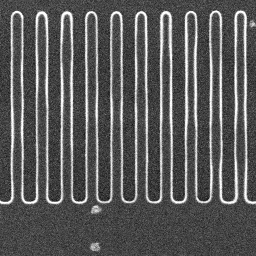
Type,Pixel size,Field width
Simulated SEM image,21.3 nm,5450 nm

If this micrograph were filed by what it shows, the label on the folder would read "groups of lines, slits or small figures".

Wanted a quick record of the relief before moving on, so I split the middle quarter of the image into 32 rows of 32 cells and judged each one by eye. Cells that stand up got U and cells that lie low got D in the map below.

UUDDDDUUDDDDUUDDDDUUUDDDUUUDDDDU
UUDDDDUUDDDDUUDDDDUUUDDDUUUDDDDU
UUDDDDUUDDDDUUDDDDUUUDDDUUUDDDDU
UUDDDDUUDDDDUUDDDDUUUDDDUUUDDDDU
UUDDDDUUDDDDUUDDDDUUUDDDUUUDDDDU
UUDDDDUUDDDDUUDDDDUUUDDDUUUDDDDU
UUDDDDUUDDDDUUDDDDUUUDDDUUUDDDDU
UUDDDDUUDDDDUUDDDDUUUDDDUUUDDDDU
UUDDDDUUDDDDUUDDDDUUUDDDUUUDDDDU
UUDDDDUUDDDDUUDDDDUUUDDDUUUDDDDU
UUDDDDUUDDDDUUDDDDUUUDDDUUUDDDDU
UUDDDDUUDDDDUUDDDDUUUDDDUUUDDDDU
UUDDDDUUDDDDUUDDDDUUUDDDUUUDDDDU
UUDDDDUUDDDDUUDDDDUUUDDDUUUDDDDU
UUDDDDUUDDDDUUDDDDUUUDDDUUUDDDDU
UUDDDDUUDDDDUUDDDDUUUDDDUUUDDDDU
UUDDDDUUDDDDUUDDDDUUUDDDUUUDDDDU
UUDDDDUUDDDDUUDDDDUUUDDDUUUDDDDU
UUDDDDUUDDDDUUDDDDUUUDDDUUUDDDDU
UUDDDDUUDDDDUUDDDDUUUDDDUUUDDDDU
UUDDDDUUDDDDUUDDDDUUUDDDUUUDDDDU
UUDDDDUUDDDDUUDDDDUUUDDDUUUDDDDU
UUDDDDUUDDDDUUDDDDUUUDDDUUUDDDDU
UUDDDDUUDDDDUUDDDDUUUDDDUUUDDDDU
UUDDDDUUDDDDUUDDDDUUUDDDUUUDDDDU
UUDDDDUUDDDDUUDDDDUUUDDDUUUDDDDU
UUDDDDUUDDDDUUDDDDUUUDDDUUUDDDDU
UUDDDDUUDDDDUUDDDDUUUDDDUUUDDDDU
UUDDDDUUDDDDUUDDDDUUUDDDUUUDDDDU
UUDDDDUUDDDDUUDDDDUUUDDDUUUDDDDU
UUDDDDUUDDDDUUDDDDUUUDDDUUUDDDDU
UUDDDDUUDDDDUUDDDDUUUDDDUUUDDDDU